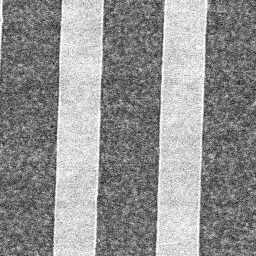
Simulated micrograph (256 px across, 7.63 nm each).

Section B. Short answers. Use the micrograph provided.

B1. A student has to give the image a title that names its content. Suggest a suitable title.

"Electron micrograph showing one or a few lines or trenches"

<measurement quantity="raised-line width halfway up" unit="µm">0.31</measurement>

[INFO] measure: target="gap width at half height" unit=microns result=0.468